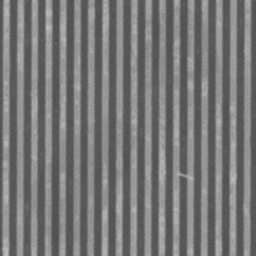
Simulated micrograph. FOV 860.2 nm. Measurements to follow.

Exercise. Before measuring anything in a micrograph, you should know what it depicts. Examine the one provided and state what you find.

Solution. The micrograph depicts parallel lines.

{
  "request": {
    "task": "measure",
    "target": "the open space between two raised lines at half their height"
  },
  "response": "10.5 pixels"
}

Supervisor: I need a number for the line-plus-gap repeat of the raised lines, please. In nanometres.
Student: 47.7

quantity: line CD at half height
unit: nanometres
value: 13